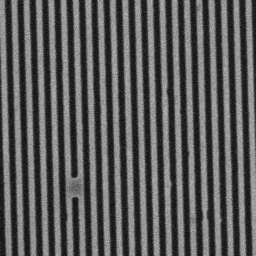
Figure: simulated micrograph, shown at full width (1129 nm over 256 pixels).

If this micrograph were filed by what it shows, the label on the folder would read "parallel lines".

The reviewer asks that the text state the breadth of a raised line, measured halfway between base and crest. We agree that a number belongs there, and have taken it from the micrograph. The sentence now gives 24.2 nm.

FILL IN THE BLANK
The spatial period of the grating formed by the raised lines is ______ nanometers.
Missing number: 54.3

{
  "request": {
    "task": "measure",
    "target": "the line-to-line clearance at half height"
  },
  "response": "28.1 nanometres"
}